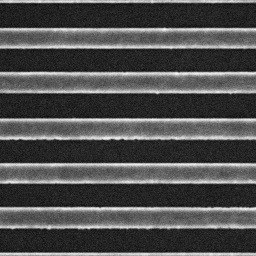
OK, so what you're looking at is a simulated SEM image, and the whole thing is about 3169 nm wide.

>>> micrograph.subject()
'lines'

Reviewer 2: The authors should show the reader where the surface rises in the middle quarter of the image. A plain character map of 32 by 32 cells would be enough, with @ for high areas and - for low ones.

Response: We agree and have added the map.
--------------------------------
--------------------------------
@@@@@@@@@@@@@@@@@@@@@@@@@@@@@@@@
@@@@@@@@@@@@@@@@@@@@@@@@@@@@@@@@
@@@@@@@@@@@@@@@@@@@@@@@@@@@@@@@@
@@@@@@@@@@@@@@@@@@@@@@@@@@@@@@@@
@@@@@@@@@@@@@@@@@@@@@@@@@@@@@@@@
--------------------------------
--------------------------------
--------------------------------
--------------------------------
--------------------------------
--------------------------------
--------------------------------
@@@@@@@@@@@@@@@@@@@@@@@@@@@@@@@@
@@@@@@@@@@@@@@@@@@@@@@@@@@@@@@@@
@@@@@@@@@@@@@@@@@@@@@@@@@@@@@@@@
@@@@@@@@@@@@@@@@@@@@@@@@@@@@@@@@
@@@@@@@@@@@@@@@@@@@@@@@@@@@@@@@@
--------------------------------
--------------------------------
--------------------------------
--------------------------------
--------------------------------
--------------------------------
@@@@@@@@@@@@@@@@@@@@@@@@@@@@@@@@
@@@@@@@@@@@@@@@@@@@@@@@@@@@@@@@@
@@@@@@@@@@@@@@@@@@@@@@@@@@@@@@@@
@@@@@@@@@@@@@@@@@@@@@@@@@@@@@@@@
@@@@@@@@@@@@@@@@@@@@@@@@@@@@@@@@
--------------------------------
--------------------------------